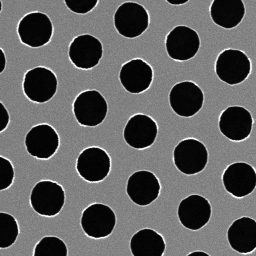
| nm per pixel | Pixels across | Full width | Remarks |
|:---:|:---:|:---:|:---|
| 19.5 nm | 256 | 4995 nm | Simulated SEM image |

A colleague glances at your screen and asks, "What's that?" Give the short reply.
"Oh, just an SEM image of a regular array of holes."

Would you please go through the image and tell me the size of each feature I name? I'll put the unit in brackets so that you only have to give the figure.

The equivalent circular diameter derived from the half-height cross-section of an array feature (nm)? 662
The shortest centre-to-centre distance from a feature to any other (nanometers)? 1080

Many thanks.